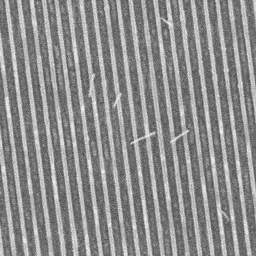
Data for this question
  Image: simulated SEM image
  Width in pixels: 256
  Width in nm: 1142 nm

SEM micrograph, parallel lines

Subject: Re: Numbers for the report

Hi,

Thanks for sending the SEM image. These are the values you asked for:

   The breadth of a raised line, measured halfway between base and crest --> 0.0155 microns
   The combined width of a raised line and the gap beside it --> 54.9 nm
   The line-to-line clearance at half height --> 38.7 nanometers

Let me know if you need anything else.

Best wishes